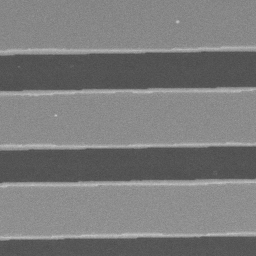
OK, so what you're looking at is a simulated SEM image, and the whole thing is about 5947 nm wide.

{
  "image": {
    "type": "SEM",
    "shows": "lines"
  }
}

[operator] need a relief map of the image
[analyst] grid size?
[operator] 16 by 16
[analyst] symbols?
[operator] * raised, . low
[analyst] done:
****************
****************
****************
................
................
................
****************
****************
****************
................
................
.***************
****************
****************
****************
................